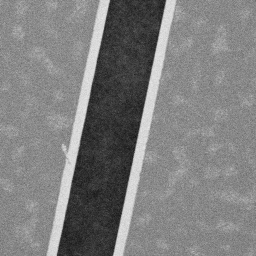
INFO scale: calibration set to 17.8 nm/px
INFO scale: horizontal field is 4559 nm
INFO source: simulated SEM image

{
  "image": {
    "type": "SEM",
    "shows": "one or a few lines or trenches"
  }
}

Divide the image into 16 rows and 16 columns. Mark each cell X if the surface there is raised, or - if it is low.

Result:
XXXXXX-----XXXXX
XXXXXX----XXXXXX
XXXXXX----XXXXXX
XXXXXX----XXXXXX
XXXXXX----XXXXXX
XXXXX-----XXXXXX
XXXXX----XXXXXXX
XXXXX----XXXXXXX
XXXXX----XXXXXXX
XXXXX----XXXXXXX
XXXX-----XXXXXXX
XXXX----XXXXXXXX
XXXX----XXXXXXXX
XXXX----XXXXXXXX
XXXX----XXXXXXXX
XXX----XXXXXXXXX